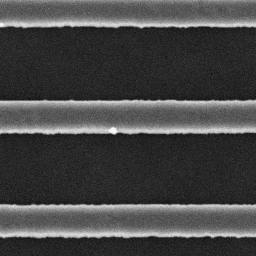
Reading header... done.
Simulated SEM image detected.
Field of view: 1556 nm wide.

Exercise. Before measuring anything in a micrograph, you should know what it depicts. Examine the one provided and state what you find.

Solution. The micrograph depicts lines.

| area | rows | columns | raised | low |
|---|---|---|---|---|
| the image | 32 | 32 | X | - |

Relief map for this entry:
XXXXXXXXXXXXXXXXXXXXXXXXXXXXXXXX
XXXXXXXXXXXXXXXXXXXXXXXXXXXXXXXX
XXXXXXXXXXXXXXXXXXXXXXXXXXXXXXXX
--------------------------------
--------------------------------
--------------------------------
--------------------------------
--------------------------------
--------------------------------
--------------------------------
--------------------------------
--------------------------------
--------------------------------
XXXXXXXXXXXXXXXXXXXXXXXXXXXXXXXX
XXXXXXXXXXXXXXXXXXXXXXXXXXXXXXXX
XXXXXXXXXXXXXXXXXXXXXXXXXXXXXXXX
XXXXXXXXXXXXXXXXXXXXXXXXXXXXXXXX
--------------------------------
--------------------------------
--------------------------------
--------------------------------
--------------------------------
--------------------------------
--------------------------------
--------------------------------
--------------------------------
XXXXXXXXXXXXXXXXXXXXXXXXXXXXXXXX
XXXXXXXXXXXXXXXXXXXXXXXXXXXXXXXX
XXXXXXXXXXXXXXXXXXXXXXXXXXXXXXXX
XXXXXXXXXXXXXXXXXXXXXXXXXXXXXXXX
--------------------------------
--------------------------------